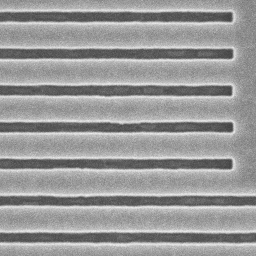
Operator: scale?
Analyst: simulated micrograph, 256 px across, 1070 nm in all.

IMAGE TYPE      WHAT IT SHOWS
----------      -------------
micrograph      parallel lines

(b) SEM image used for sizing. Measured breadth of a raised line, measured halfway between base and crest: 111 nm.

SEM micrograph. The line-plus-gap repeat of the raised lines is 154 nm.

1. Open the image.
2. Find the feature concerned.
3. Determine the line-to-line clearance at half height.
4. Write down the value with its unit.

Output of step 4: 44.4 nanometres